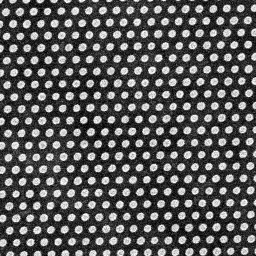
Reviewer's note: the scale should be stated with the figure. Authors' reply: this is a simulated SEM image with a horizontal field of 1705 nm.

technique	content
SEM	a regular array of raised bodies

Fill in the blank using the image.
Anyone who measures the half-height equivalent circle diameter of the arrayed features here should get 7.06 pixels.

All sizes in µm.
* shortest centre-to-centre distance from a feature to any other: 0.091